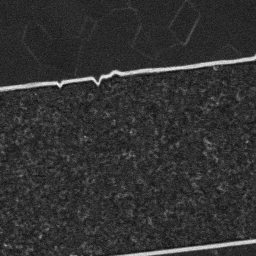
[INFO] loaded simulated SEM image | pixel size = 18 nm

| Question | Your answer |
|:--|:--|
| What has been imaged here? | one or a few lines or trenches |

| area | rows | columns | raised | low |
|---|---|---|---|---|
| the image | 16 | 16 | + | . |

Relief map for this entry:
++++++++++++++++
++++++++++++++++
++++++++++++++++
++++++++++++++++
+++++++++.......
................
................
................
................
................
................
................
................
................
................
............++++